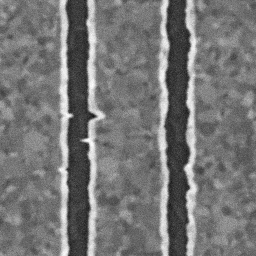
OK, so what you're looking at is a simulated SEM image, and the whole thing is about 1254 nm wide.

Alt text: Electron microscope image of one or a few lines or trenches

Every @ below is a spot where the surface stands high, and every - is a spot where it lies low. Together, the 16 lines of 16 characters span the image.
@@@@--@@@@--@@@@
@@@@--@@@@--@@@@
@@@@--@@@@--@@@@
@@@@--@@@@--@@@@
@@@@--@@@@--@@@@
@@@@--@@@@--@@@@
@@@@--@@@@--@@@@
@@@@--@@@@--@@@@
@@@@--@@@@--@@@@
@@@@--@@@@--@@@@
@@@@--@@@@--@@@@
@@@@--@@@@--@@@@
@@@@--@@@@--@@@@
@@@@--@@@@--@@@@
@@@@--@@@@--@@@@
@@@@--@@@@--@@@@